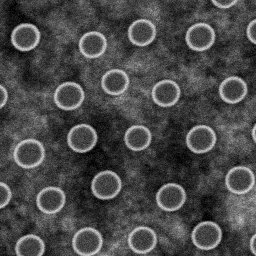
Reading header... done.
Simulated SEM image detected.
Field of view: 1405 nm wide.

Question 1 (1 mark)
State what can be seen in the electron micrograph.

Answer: a regular array of raised bodies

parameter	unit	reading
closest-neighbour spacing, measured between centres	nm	284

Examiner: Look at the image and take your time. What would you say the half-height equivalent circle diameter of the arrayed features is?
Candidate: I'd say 147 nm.